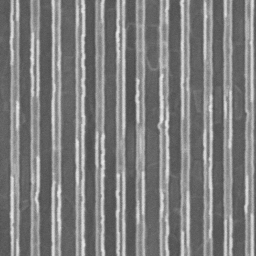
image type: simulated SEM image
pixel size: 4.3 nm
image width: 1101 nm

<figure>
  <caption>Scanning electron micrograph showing parallel lines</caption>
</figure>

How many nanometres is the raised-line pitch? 91.7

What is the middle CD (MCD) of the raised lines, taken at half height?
32.3 nanometers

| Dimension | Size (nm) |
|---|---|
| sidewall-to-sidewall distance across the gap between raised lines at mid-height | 55.9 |